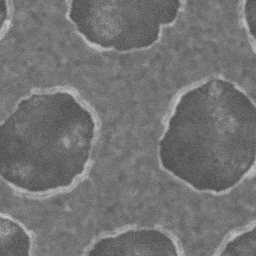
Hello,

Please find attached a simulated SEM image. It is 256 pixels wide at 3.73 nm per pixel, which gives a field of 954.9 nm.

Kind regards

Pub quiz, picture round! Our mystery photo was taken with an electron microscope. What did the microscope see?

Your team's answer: holes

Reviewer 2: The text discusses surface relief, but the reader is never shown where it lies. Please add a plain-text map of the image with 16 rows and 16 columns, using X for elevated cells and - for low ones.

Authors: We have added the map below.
XXXX-------XXXX-
XXXXX------XXXX-
XXXXX-----XXXXXX
XXXXXXXXXXXXXXXX
XXXXXXXXXXXXXXXX
XXXXXXXXXXXX---X
X----XXXXXX-----
------XXXXX-----
------XXXX------
------XXXX------
-----XXXXX------
X---XXXXXXXX---X
XXXXXXXXXXXXXXXX
XXXXXXXXXXXXXXXX
--XXXXXX--XXXXX-
--XXXX-----XXX--